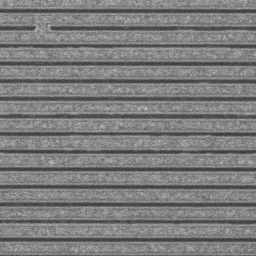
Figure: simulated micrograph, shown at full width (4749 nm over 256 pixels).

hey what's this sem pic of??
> parallel lines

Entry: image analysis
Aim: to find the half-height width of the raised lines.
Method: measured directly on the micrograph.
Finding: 230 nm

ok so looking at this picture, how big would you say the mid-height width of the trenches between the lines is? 97.4 nm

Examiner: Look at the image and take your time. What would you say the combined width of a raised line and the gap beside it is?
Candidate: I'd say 326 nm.